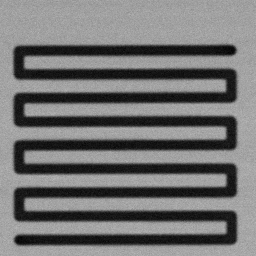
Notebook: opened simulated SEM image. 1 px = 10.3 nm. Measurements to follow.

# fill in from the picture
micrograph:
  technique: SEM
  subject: groups of lines, slits or small figures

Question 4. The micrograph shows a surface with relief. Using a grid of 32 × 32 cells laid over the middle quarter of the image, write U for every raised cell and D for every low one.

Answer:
UUUUUUUUUUUUUUUUUUUUUUUUUUUUUUUU
DDDDDDDDDDDDDDDDDDDDDDDDDDDDDDDD
DDDDDDDDDDDDDDDDDDDDDDDDDDDDDDDD
DDDDDDDDDDDDDDDDDDDDDDDDDDDDDDDD
UUUUUUUUUUUUUUUUUUUUUUUUUUUUUUUU
UUUUUUUUUUUUUUUUUUUUUUUUUUUUUUUU
UUUUUUUUUUUUUUUUUUUUUUUUUUUUUUUU
DDDDDDDDDDDDDDDDDDDDDDDDDDDDDDDD
DDDDDDDDDDDDDDDDDDDDDDDDDDDDDDDD
DDDDDDDDDDDDDDDDDDDDDDDDDDDDDDDD
UUUUUUUUUUUUUUUUUUUUUUUUUUUUUUUU
UUUUUUUUUUUUUUUUUUUUUUUUUUUUUUUU
UUUUUUUUUUUUUUUUUUUUUUUUUUUUUUUU
DDDDDDDDDDDDDDDDDDDDDDDDDDDDDDDD
DDDDDDDDDDDDDDDDDDDDDDDDDDDDDDDD
DDDDDDDDDDDDDDDDDDDDDDDDDDDDDDDD
UUUUUUUUUUUUUUUUUUUUUUUUUUUUUUUU
UUUUUUUUUUUUUUUUUUUUUUUUUUUUUUUU
UUUUUUUUUUUUUUUUUUUUUUUUUUUUUUUU
DDDDDDDDDDDDDDDDDDDDDDDDDDDDDDDD
DDDDDDDDDDDDDDDDDDDDDDDDDDDDDDDD
DDDDDDDDDDDDDDDDDDDDDDDDDDDDDDDD
UUUUUUUUUUUUUUUUUUUUUUUUUUUUUUUU
UUUUUUUUUUUUUUUUUUUUUUUUUUUUUUUU
UUUUUUUUUUUUUUUUUUUUUUUUUUUUUUUU
DDDDDDDDDDDDDDDDDDDDDDDDDDDDDDDD
DDDDDDDDDDDDDDDDDDDDDDDDDDDDDDDD
DDDDDDDDDDDDDDDDDDDDDDDDDDDDDDDD
UUUUUUUUUUUUUUUUUUUUUUUUUUUUUUUU
UUUUUUUUUUUUUUUUUUUUUUUUUUUUUUUU
UUUUUUUUUUUUUUUUUUUUUUUUUUUUUUUU
DDDDDDDDDDDDDDDDDDDDDDDDDDDDDDDD